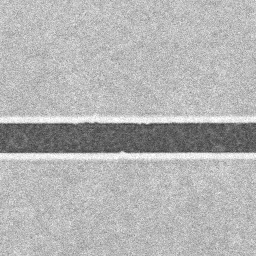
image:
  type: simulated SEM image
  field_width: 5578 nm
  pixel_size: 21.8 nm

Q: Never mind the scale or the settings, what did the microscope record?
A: one or a few lines or trenches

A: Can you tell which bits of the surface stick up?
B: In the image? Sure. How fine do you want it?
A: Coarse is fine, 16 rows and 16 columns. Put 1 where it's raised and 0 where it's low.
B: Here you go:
1111111111111111
1111111111111111
1111111111111111
1111111111111111
1111111111111111
1111111111111111
1111111111111111
0000100000000000
0000000000000000
0000000000000000
1111111111111111
1111111111111111
1111111111111111
1111111111111111
1111111111111111
1111111111111111